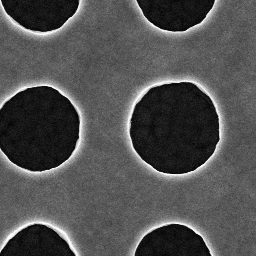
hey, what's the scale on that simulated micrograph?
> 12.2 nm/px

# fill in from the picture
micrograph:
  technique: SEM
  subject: holes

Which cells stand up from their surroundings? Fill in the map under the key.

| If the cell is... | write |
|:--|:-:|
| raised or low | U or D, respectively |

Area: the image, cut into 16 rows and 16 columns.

DDDDDUUUUDDDDUUU
UDDDUUUUUUDDUUUU
UUUUUUUUUUUUUUUU
UUUUUUUUUUUUUUUU
UUUUUUUUUUUUUUUU
UUDUUUUUUDDDDUUU
DDDDDUUUUDDDDUUU
DDDDDUUUDDDDDDUU
DDDDDUUUDDDDDDUU
DDDDDUUUUDDDDUUU
UDDUUUUUUUDDUUUU
UUUUUUUUUUUUUUUU
UUUUUUUUUUUUUUUU
UUUUUUUUUUUUUUUU
UDDDUUUUUDDDUUUU
DDDDUUUUUDDDDUUU